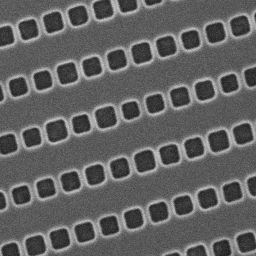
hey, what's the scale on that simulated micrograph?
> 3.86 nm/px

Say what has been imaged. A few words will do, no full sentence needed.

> a regular array of holes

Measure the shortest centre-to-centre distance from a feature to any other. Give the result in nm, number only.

98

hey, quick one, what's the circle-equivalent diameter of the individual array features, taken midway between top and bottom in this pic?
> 81.4 nm